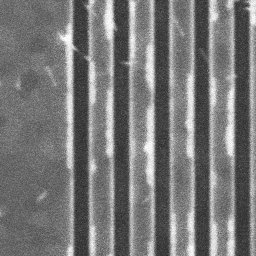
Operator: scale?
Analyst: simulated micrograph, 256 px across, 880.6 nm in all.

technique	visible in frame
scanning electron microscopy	parallel lines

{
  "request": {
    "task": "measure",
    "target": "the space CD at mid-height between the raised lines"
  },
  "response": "0.0614 microns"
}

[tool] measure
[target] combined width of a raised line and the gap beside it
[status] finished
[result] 139 nm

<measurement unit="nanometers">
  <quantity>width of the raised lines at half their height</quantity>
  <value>77.3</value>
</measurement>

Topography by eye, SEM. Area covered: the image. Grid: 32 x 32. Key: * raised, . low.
*********..***..***..***..***..*
*********..***..***..***..***..*
*********..***..***..***..***..*
*********..***..***..***..***..*
*********..***..***..***..***..*
*********..***..***..***..***..*
*********..***..***..***..***..*
*********..***..***..***..***..*
*********..***..***..***..***..*
*********..***..***..***..***..*
*********..***..***..***..***..*
*********..***..***..***..***..*
*********..***..***..***..***..*
*********..***..***..***..***..*
*********..***..***..***..***..*
*********..***..***..***..***..*
*********..***..***..***..***..*
*********..***..***..***..***..*
*********..***..***..***..***..*
*********..***..***..***..***..*
*********..***..***..***..***..*
*********..***..***..***..***..*
*********..***..***..***..***..*
*********..***..***..***..***..*
*********..***..***..***..***..*
*********..***..***..***..***..*
*********..***..***..***..***..*
*********..***..***..***..***..*
*********..***..***..***..***..*
*********..***..***..***..***..*
*********..***..***..***..***..*
*********..***..***..***..***...